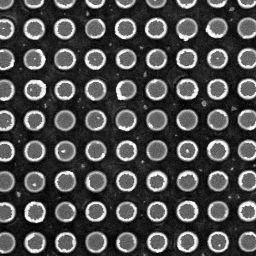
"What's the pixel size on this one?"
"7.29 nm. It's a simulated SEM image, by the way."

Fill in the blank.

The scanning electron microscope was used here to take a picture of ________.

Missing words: a regular array of raised bodies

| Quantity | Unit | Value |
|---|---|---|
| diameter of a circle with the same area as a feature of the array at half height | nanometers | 151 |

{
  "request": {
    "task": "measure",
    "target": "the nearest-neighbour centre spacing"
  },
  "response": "0.221 um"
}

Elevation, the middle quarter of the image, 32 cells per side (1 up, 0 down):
11000011110000111000011110000111
00000000000000000000000000000000
00000000000000000000000000000000
00000000000000000000000000000000
11000011110000111000001110000111
11000011110001111100011111001111
11100111110001111100011111001111
11000011110001111100011110000111
11000011110001111000011110000011
00000000000000000000000000000000
00000000000000000000000000000000
00000000000000000000000000000000
11000011110000111000011110000111
11100011110001111100011111001111
11100111110001111100011111001111
11000011110001111100011110000111
10000001100000010000001100000011
00000000000000000000000000000000
00000000000000000000000000000000
10000001100000011000001110000111
11100011110001111100011110000111
11100111110001111100011111001111
11100011110001111100011110001111
11000011110000111000011110000111
00000000000000000000000000000000
00000000000000000000000000000000
00000000000000000000000000000000
11000001110000111000001110000111
11100011110001111100011111001111
11100011110001111100011111001111
11100011110001111100011111000111
11000001100000111000001100000011